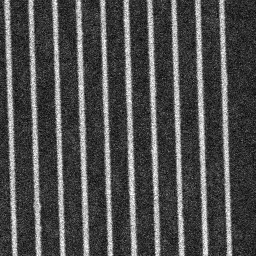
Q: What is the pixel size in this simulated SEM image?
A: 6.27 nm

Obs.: parallel lines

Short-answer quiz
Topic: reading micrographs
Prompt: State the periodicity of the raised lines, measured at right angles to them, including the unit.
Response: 149 nm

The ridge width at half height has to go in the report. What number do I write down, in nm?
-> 28.2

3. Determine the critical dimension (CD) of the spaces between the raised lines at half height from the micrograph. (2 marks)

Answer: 122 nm